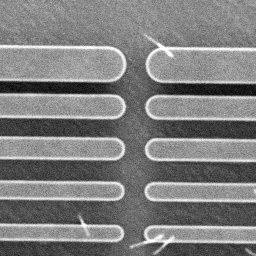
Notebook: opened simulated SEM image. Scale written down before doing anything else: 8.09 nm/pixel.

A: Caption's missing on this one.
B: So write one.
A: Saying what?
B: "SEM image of groups of lines, slits or small figures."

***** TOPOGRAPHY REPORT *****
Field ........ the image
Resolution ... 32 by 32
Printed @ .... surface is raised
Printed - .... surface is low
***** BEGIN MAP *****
--------------------------------
--------------------------------
--------------------------------
--------------------------------
--------------------------------
--------------------------------
@@@@@@@@@@@@@@@----@@@@@@@@@@@@@
@@@@@@@@@@@@@@@@--@@@@@@@@@@@@@@
@@@@@@@@@@@@@@@@--@@@@@@@@@@@@@@
@@@@@@@@@@@@@@@----@@@@@@@@@@@@@
--------------------------------
--------------------------------
@@@@@@@@@@@@@@@----@@@@@@@@@@@@@
@@@@@@@@@@@@@@@@--@@@@@@@@@@@@@@
@@@@@@@@@@@@@@@----@@@@@@@@@@@@@
--------------------------------
--------------------------------
@@@@@@@@@@@@@@@----@@@@@@@@@@@@-
@@@@@@@@@@@@@@@---@@@@@@@@@@@@@@
@@@@@@@@@@@@@@@----@@@@@@@@@@@@@
--------------------------------
--------------------------------
--------------------------------
@@@@@@@@@@@@@@@---@@@@@@@@@@@@@@
@@@@@@@@@@@@@@@---@@@@@@@@@@@@@@
--------------------------------
--------------------------------
--------------------------------
@@@@@@@@@@@@@@@----@@@@@@@@@@@@@
@@@@@@@@@@@@@@@---@@@@@@@@@@@@@@
--------------------------------
--------------------------------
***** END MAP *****